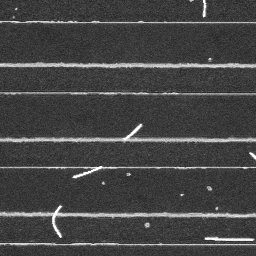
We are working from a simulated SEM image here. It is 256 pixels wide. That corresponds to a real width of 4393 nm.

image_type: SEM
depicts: lines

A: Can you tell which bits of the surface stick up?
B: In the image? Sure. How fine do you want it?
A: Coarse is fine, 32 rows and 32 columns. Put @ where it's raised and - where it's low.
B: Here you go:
--------------------------------
--------------------------------
--------------------------------
@@@@@@@@@@@@@@@@@@@@@@@@@@@@@@@@
@@@@@@@@@@@@@@@@@@@@@@@@@@@@@@@@
@@@@@@@@@@@@@@@@@@@@@@@@@@@@@@@@
@@@@@@@@@@@@@@@@@@@@@@@@@@@@@@@@
@@@@@@@@@@@@@@@@@@@@@@@@@@@@@@@@
--------------------------------
--------------------------------
--------------------------------
--------------------------------
@@@@@@@@@@@@@@@@@@@@@@@@@@@@@@@@
@@@@@@@@@@@@@@@@@@@@@@@@@@@@@@@@
@@@@@@@@@@@@@@@@@@@@@@@@@@@@@@@@
@@@@@@@@@@@@@@@@@@@@@@@@@@@@@@@@
@@@@@@@@@@@@@@@@@@@@@@@@@@@@@@@@
-@@@-----@---------------@@@@---
--------------------------------
--------------------------------
--------------------------------
@@@@@@@@@@@@@@@@@@@@@@@@@@@@@@@@
@@@@@@@@@@@@@@@@@@@@@@@@@@@@@@@@
@@@@@@@@@@@@@@@@@@@@@@@@@@@@@@@@
@@@@@@@@@@@@@@@@@@@@@@@@@@@@@@@@
@@@@@@@@@@@@@@@@@@@@@@@@@@@@@@@@
@@@@@@@@@@@@@@@@@@@@@@@@@@@@@@@@
--------------------------------
--------------------------------
--------------------------------
--------------------------------
@@@@@@@@@@@@@@@@@@@@@@@@@@@@@@@@